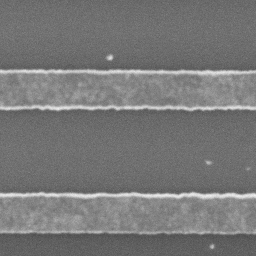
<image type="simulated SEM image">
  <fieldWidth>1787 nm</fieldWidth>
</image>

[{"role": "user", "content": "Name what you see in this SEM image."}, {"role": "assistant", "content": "lines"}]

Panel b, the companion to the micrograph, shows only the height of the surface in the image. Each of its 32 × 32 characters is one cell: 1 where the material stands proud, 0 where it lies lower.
00000000000000000000000000000000
00000000000000000000000000000000
00000000000000000000000000000000
00000000000000000000000000000000
00000000000000000000000000000000
00000000000000000000000000000000
00000000000000000000000000000000
00000000000000000000000000000000
00000000000000000000000000000000
11111111111111111111111111111111
11111111111111111111111111111111
11111111111111111111111111111111
11111111111111111111111111111111
11110111111111111111111111111111
00000000000000000000000000000000
00000000000000000000000000000000
00000000000000000000000000000000
00000000000000000000000000000000
00000000000000000000000000000000
00000000000000000000000000000000
00000000000000000000000000000000
00000000000000000000000000000000
00000000000000000000000000000000
00000000000000000000000000000000
11111111111111111111111111111111
11111111111111111111111111111111
11111111111111111111111111111111
11111111111111111111111111111111
11111111111111111111111111111111
00000000000000000000000000000000
00000000000000000000000000000000
00000000000000000000000000000000